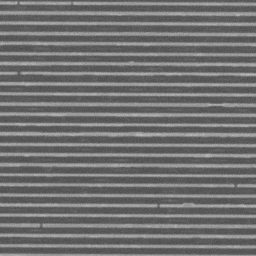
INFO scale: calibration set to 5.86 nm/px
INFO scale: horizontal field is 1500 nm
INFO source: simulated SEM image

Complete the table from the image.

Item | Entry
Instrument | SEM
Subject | parallel lines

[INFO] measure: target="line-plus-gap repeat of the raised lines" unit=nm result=59.2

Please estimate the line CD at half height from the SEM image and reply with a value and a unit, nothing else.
16.8 nm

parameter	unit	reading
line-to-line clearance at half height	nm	42.1